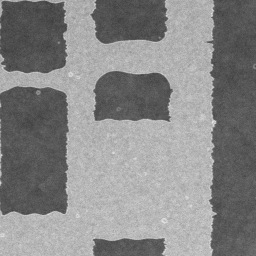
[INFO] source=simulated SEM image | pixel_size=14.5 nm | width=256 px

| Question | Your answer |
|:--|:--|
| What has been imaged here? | one or a few lines or trenches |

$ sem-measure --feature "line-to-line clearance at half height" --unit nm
999